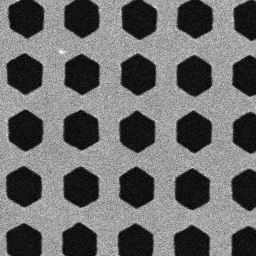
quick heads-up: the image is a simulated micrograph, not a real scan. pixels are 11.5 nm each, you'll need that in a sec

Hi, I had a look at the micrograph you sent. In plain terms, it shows a regular array of holes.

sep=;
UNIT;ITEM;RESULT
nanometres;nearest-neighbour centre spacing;642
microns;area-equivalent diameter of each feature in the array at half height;0.44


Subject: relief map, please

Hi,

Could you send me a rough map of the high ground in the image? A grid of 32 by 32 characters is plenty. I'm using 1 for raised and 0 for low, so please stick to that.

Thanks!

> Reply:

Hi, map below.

10000111100011110001111000111100
10000011000011100000110000011000
10000111000011100000110000011000
10000111000011100000110000111000
11101111110111111001111101111110
11111111111111111111111111111111
11111111111111111111111111111111
10000111100011110001111001111100
10000111000011100001110000111000
10000111000011100000110000011000
10000111000011100001110000011000
11101111110111110011111000111100
11111111111111111111111111111111
11111111111111111111111111111111
11001111000011110011111001111100
10000111000011100001110000111000
10000111000011100001110000011000
10000111000011100001110000111000
11001111110111110011111001111100
11111111111111111111111111111111
11111111111111111111111111111111
11001111100111110011111001111100
10000111000011100001110000111000
10000111000011100001110000111000
10000111000011100001110000111000
11001111100111110011111000111100
11111111111111111111111111111111
11111111111111111111111111111111
11001111100111110011111001111100
10000111000011100001110000111000
10000111000011100001110000111000
10000111000011100001110000111000